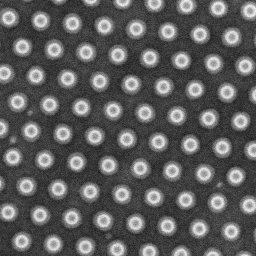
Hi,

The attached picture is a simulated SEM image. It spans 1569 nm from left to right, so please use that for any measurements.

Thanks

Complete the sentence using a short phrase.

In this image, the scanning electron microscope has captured an array of small figures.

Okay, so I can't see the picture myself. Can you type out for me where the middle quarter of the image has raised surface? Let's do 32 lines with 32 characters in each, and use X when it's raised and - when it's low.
--------------------XXX----XXXX-
XX------------------------------
XXX----XXX----------------------
XXX----XXXX----XXXX-----XX------
XXX----XXXX---XXXXX----XXXX----X
XX-----XXXX---XXXXX----XXXX----X
--------XX-----XXXX----XXXX---XX
----------------XX-----XXX-----X
-------------------------------X
--XXXX-----XX-------------------
--XXXXX---XXXX-----XXX----------
--XXXXX---XXXXX---XXXXX---XXXX--
---XXX----XXXXX---XXXXX---XXXXX-
-----------XXX----XXXX----XXXXX-
-------------------XX-----XXXX--
X-------------------------------
XX----XXXX-----XX---------------
XX---XXXXX----XXXX----XXX-------
XX---XXXXX---XXXXX---XXXXX----XX
X-----XXXX---XXXXX---XXXXX---XXX
--------------XXX----XXXXX---XXX
----------------------XXX----XXX
--XXX--------------------------X
-XXXX-----XXX-------------------
-XXXXX---XXXX----XXXX-----XX----
-XXXX----XXXXX---XXXX----XXXX---
--XXX----XXXX----XXXXX---XXXX---
----------XX-----XXXX----XXXX---
------------------XX-----XXXX---
--------------------------------
X----XXXX----XXX----------------
X---XXXXX---XXXXX----XXX--------